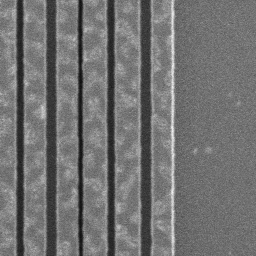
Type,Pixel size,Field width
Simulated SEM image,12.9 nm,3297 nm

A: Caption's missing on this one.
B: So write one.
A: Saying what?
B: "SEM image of parallel lines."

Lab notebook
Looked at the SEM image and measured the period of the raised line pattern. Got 0.41 micrometres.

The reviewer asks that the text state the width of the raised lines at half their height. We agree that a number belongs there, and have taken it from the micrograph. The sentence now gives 275 nanometres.